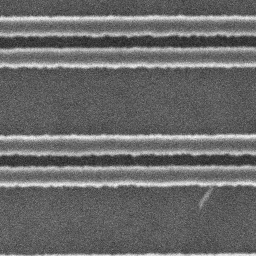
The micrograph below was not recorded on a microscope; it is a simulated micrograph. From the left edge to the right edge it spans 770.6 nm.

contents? lines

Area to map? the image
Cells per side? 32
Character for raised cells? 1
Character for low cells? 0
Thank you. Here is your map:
00000000000000000000000000000000
00000000000000000000000000000000
11111111111111111111111111111111
11111111111111111111111111111111
10000100000110000001000000000000
00000000000000000000000000000000
11111111111111111111111111111111
11111111111111111111111111111111
00000000000000000000000000000000
00000000000000000000000000000000
00000000000000000000000000000000
00000000000000000000000000000000
00000000000000000000000000000000
00000000000000000000000000000000
00000000000000000000000000000000
00000000000000000000000000000000
00000000000000000000000000000000
11111111111111111111111111111111
11111111111111111111111111111111
00000000000000000000000000000000
00000000000000000000000000000000
11111111111111111111111111111111
11111111111111111111111111111111
00000000000000000000000000000000
00000000000000000000000000000000
00000000000000000000000000000000
00000000000000000000000000000000
00000000000000000000000000000000
00000000000000000000000000000000
00000000000000000000000000000000
00000000000000000000000000000000
00000000000000000000000000000000